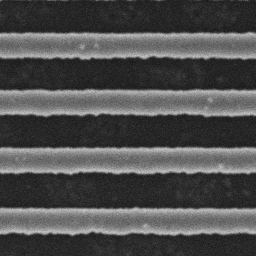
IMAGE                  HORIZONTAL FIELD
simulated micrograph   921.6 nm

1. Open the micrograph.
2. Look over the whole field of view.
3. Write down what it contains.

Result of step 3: lines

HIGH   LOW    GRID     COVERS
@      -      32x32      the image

--------------------------------
--------------------------------
--------------------------------
--------------------------------
@@@@@@@@@@@@@@@@@@@@@@@@@@@@@@@@
@@@@@@@@@@@@@@@@@@@@@@@@@@@@@@@@
@@@@@@@@@@@@@@@@@@@@@@@@@@@@@@@@
--------------------------------
--------------------------------
--------------------------------
--------------------------------
@@@@@@@@@@@@@@@@@@@@@@@@@@@@@@@@
@@@@@@@@@@@@@@@@@@@@@@@@@@@@@@@@
@@@@@@@@@@@@@@@@@@@@@@@@@@@@@@@@
--------------------------@-@@--
--------------------------------
--------------------------------
--------------------------------
@@--@@@@@@@-@@@@@@@@@-@@@@@@-@@@
@@@@@@@@@@@@@@@@@@@@@@@@@@@@@@@@
@@@@@@@@@@@@@@@@@@@@@@@@@@@@@@@@
@@@-@@@@@@---@@@@@@@@-@@@@@@@@@@
--------------------------------
--------------------------------
--------------------------------
--------------------------------
@@@@@@@@@@@@@@@@@@@@@@@@@@@@@@@@
@@@@@@@@@@@@@@@@@@@@@@@@@@@@@@@@
@@@@@@@@@@@@@@@@@@@@@@@@@@@@@@@@
--------------------------------
--------------------------------
--------------------------------